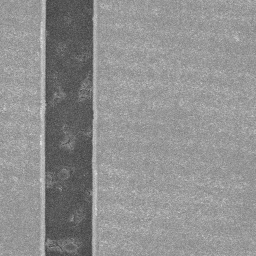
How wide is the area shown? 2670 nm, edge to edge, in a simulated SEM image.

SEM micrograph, one or a few lines or trenches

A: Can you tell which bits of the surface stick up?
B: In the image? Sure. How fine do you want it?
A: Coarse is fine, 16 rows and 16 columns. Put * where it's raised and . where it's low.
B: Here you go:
***...**********
***...**********
***...**********
***...**********
***...**********
***...**********
***...**********
***...**********
***...**********
***...**********
***...**********
***...**********
***...**********
***...**********
***...**********
***...**********